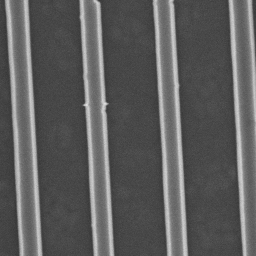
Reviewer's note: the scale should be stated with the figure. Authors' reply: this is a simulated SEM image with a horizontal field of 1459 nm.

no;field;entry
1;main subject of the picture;one or a few lines or trenches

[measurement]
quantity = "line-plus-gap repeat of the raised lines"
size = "420 nm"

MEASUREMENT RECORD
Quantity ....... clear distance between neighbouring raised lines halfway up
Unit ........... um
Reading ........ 0.322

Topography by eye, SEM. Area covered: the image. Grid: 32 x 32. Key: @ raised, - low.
-@@-------@@-------@@--------@@-
-@@-------@@-------@@@-------@@-
-@@-------@@--------@@-------@@-
-@@-------@@--------@@-------@@-
-@@-------@@--------@@-------@@-
-@@@------@@@-------@@-------@@@
-@@@------@@@-------@@-------@@@
-@@@-------@@-------@@-------@@@
-@@@-------@@-------@@-------@@@
--@@-------@@-------@@-------@@@
--@@-------@@-------@@-------@@@
--@@-------@@-------@@-------@@@
--@@-------@@-------@@-------@@@
--@@-------@@-------@@--------@@
--@@-------@@-------@@--------@@
--@@-------@@-------@@--------@@
--@@-------@@-------@@--------@@
--@@-------@@-------@@--------@@
--@@-------@@-------@@--------@@
--@@-------@@--------@@-------@@
--@@-------@@--------@@-------@@
--@@-------@@--------@@-------@@
--@@-------@@--------@@-------@@
--@@@------@@@-------@@-------@@
--@@@------@@@-------@@-------@@
--@@@-------@@-------@@-------@@
--@@@-------@@-------@@-------@@
--@@@-------@@-------@@-------@@
--@@@-------@@-------@@-------@@
---@@-------@@-------@@-------@@
---@@-------@@-------@@-------@@
---@@-------@@-------@@--------@